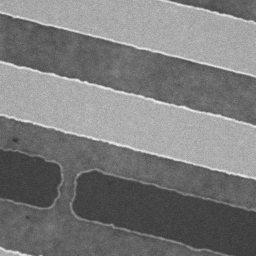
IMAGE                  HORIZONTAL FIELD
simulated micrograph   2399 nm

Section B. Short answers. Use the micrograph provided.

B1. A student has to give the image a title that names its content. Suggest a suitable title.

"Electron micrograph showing one or a few lines or trenches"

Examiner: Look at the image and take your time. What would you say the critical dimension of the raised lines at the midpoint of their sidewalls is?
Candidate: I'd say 485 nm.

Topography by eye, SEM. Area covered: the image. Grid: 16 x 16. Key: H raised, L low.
HHHHHHHHHHHHLLLL
LLLHHHHHHHHHHHHH
LLLLLLLHHHHHHHHH
LLLLLLLLLLLHHHHH
HHHLLLLLLLLLLLLH
HHHHHHHLLLLLLLLL
HHHHHHHHHHLLLLLL
LHHHHHHHHHHHHHHL
LLLLLHHHHHHHHHHH
HLLLLLLLLHHHHHHH
HHHHLLLLLLLLLHHH
HHHHLHHHHLLLLLLL
HHHHLHHHHHHHHLLL
LLLLLHHHHHHHHHHH
LLLLLLLLHHHHHHHH
LLLLLLLLLLLLHHHH